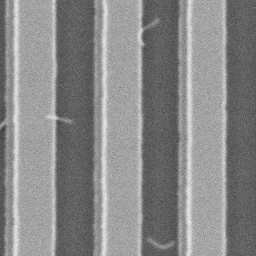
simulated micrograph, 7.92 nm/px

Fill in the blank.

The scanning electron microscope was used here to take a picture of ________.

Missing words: lines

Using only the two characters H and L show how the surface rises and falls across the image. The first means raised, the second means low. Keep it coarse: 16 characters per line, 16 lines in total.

HHHLLLHHHLLHHHLL
HHHLLLHHHLLHHHLL
HHHLLLHHHLLHHHLL
HHHLLLHHHLLHHHLL
HHHLLLHHHLLHHHLL
HHHLLLHHHLLHHHLL
HHHLLLHHHLLHHHLL
HHHLLLHHHLLHHHLL
HHHLLLHHHLLHHHLL
HHHLLLHHHLLHHHLL
HHHLLLHHHLLHHHLL
HHHLLLHHHLLHHHLL
HHHLLLHHHLLHHHLL
HHHLLLHHHLLHHHLL
HHHLLLHHHLLHHHLL
HHHLLLHHHLLHHHLL